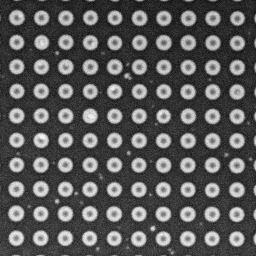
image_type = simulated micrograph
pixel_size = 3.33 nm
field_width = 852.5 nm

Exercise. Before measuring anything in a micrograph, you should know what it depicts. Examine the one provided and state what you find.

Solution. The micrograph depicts an array of small figures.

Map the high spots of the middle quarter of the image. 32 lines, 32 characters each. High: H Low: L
HHLLLHHHLLLHHHLLLHHHHLLHHHHLLHHH
HHLLLHHHLLLHHHLLLHHHLLLHHHHLLHHH
LLLLLLLLLLLLHLLLLLHLLLLLHHLLLLHH
LLLLLLLLLLLLLLLLLLLLLLLLLLLLLLLL
LLLLLLLLLLLLLLLLLLLLLLLLLLLLLLLL
HHLLLHHHLLLHHHLLLLHHLLLLHHLLLLHH
HHLLLHHHLLLHHHLLLHHHHLLHHHHLLHHH
HHLLLHHHLLLHHHLLLHHHHLLHHHHLLHHH
LLLLLLHLLLLLHHLLLLHHLLLLHHLLLLHH
LLLLLLLLLLLLLLLLLLLLLLLLLLLLLLLL
LLLLLLLLLLLLLLLLLLLLLLLLLLLLLLLL
HLLLLLHHLLLLHHLLLLHHLLLLHHLLLLHH
HHLLLHHHLLLHHHLLLHHHHLLHHHHLLHHH
HHLLLHHHLLLHHHLLLHHHHLLHHHHLLHHH
HLLLLLHLLLLLHHLLLLHHLLLLHHLLLLHH
LLLLLLLLLLLLLLLLLLLLLLLLLLLLLLLL
LLLLLLLLLLLLLLLLLLLLLLLLLLLLLLLL
HLLLLLHLLLLLHHLLLLHHLLLLHHLLLLLL
HHLLLHHHLLLHHHLLLHHHLLLHHHLLLHHH
HHLLLHHHLLLHHHLLLHHHLLLHHHHLLHHH
HLLLLHHHLLLLHHLLLLHHLLLLHHLLLLHH
LLLLLLLLLLLLLLLLLLLLLLLLLLLLLLLL
LLLLLLLLLLLLLLLLLLLLLLLLLLLLLLLL
LLLLLLLLLLLLLLLLLLLLLLLLLLLLLLLL
HHLLLHHHLLLHHHLLLHHHLLLHHHLLLHHH
HHLLLHHHLLLHHHLLLHHHLLLHHHHLLHHH
HHLLLHHHLLLHHHLLLHHHLLLHHHLLLLHH
LLLLLLLLLLLLLLLLLLLLLLLLLLLLLLLL
LLLLLLLLLLLLLLLLLLLLLLLLLLLLLLLL
LLLLLLLLLLLLLLLLLLLLLLLLLLLLLLLL
HHLLLHHHLLLHHHLLLHHHLLLHHHLLLLHH
HHLLLHHHLLLHHHLLLHHHLLLHHHHLLHHH